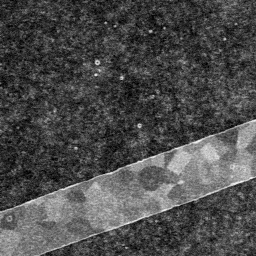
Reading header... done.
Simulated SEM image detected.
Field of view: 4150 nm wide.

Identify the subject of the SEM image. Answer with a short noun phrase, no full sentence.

one or a few lines or trenches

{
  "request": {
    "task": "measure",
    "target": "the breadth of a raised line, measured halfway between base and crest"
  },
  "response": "0.881 um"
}